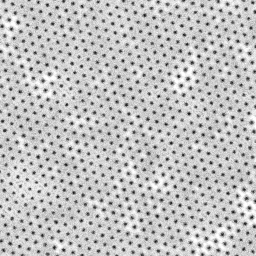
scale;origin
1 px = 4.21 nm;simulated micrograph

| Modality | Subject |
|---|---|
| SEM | a regular array of holes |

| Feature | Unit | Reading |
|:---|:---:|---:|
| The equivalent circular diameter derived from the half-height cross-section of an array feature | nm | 14.3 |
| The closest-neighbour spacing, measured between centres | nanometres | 39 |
